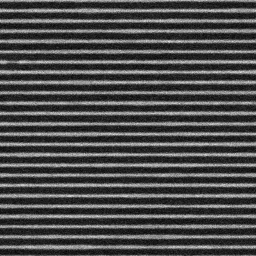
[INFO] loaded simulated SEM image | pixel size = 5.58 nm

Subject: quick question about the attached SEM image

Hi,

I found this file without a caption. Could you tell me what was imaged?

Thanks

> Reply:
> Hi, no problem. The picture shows parallel lines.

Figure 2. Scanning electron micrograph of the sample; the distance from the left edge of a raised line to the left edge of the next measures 57.4 nanometers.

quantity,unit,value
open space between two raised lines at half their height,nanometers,43.3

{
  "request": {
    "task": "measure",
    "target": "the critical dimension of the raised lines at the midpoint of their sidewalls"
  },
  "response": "2.63 px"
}